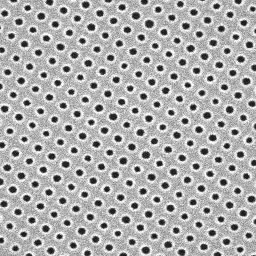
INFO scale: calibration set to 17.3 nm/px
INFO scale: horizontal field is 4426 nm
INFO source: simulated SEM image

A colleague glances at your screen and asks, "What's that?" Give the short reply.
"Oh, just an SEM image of a regular array of holes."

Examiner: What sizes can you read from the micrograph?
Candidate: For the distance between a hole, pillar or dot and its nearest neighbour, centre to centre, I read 0.275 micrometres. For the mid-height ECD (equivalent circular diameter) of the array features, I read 129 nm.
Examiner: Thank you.